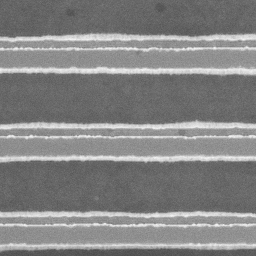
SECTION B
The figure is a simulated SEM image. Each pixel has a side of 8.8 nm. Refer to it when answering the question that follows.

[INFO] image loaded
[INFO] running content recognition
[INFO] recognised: lines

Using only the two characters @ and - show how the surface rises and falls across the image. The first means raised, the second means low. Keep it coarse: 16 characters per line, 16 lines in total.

----------------
----------------
@@@@@@@@@@@@@@@@
@@@@@@@@@@@@@@@@
----------------
----------------
----------------
----------------
@@@@@@@@@@@@@@@@
@@@@@@@@@@@@@@@@
----------------
----------------
----------------
@@@@@@@@@@@@@@@@
@@@@@@@@@@@@@@@@
----------------